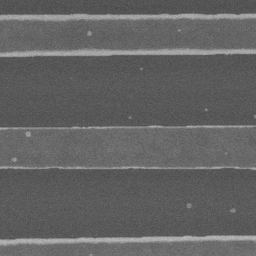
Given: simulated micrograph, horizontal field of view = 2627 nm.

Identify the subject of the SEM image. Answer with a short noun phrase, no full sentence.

lines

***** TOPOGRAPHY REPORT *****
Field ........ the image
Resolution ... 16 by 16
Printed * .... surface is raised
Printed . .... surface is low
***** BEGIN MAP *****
................
****************
****************
................
................
................
................
................
****************
****************
****************
................
................
................
................
****************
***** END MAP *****